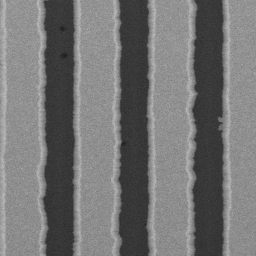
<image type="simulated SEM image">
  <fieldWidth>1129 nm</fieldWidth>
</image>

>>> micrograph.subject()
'lines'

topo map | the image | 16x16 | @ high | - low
@@@--@@--@@@--@@
@@@--@@--@@@--@@
@@@--@@--@@@--@@
@@@--@@--@@@--@@
@@@--@@--@@@--@@
@@@--@@--@@@--@@
@@@--@@--@@@--@@
@@@--@@--@@@--@@
@@@--@@--@@@--@@
@@@--@@--@@@--@@
@@@--@@--@@@--@@
@@@--@@--@@@--@@
@@@--@@--@@@--@@
@@@--@@--@@@--@@
@@@--@@--@@@--@@
@@@--@@--@@@--@@